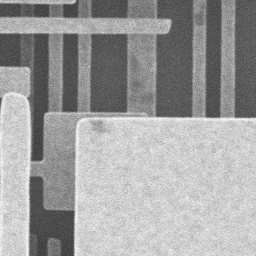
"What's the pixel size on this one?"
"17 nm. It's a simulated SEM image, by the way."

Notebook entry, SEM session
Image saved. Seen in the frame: wiring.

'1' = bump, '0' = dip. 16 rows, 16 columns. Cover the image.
0000000000000000
0000000000000000
0000000000000000
0000000000000000
0000000000000000
0000000000000000
1100000000000000
1100011111111111
1100011111111111
1100011111111111
1100011111111111
1100011111111111
1100011111111111
1100011111111111
1100011111111111
1100011111111111